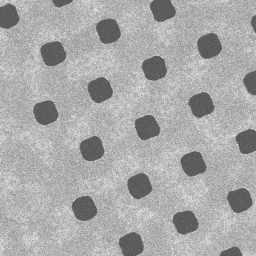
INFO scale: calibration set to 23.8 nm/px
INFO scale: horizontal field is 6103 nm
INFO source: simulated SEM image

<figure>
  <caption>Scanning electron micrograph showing a regular array of holes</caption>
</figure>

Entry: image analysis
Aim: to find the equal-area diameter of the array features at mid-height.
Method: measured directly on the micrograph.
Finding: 591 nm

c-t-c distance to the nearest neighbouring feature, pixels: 58.7